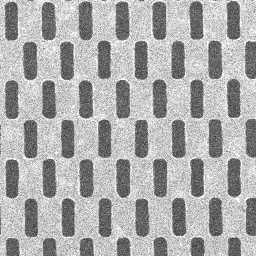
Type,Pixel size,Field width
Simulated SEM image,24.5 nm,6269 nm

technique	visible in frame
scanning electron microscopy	a regular array of holes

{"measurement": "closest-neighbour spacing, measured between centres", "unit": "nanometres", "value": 904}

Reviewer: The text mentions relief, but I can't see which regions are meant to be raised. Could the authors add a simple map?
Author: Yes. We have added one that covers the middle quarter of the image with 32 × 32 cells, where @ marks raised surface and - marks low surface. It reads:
---@@@@@----@@@@@@---@@@@@@---@@
---@@@@@----@@@@@@---@@@@@@---@@
---@@@@@----@@@@@@---@@@@@@---@@
--@@@@@@@--@@@@@@@---@@@@@@---@@
@@@@--@@@@@@@---@@@@@@---@@@@@@@
@@@@---@@@@@@----@@@@@----@@@@@-
@@@@---@@@@@@----@@@@@----@@@@@-
@@@@---@@@@@@----@@@@@----@@@@@-
@@@@---@@@@@@----@@@@@----@@@@@-
@@@@---@@@@@@----@@@@@----@@@@@-
@@@@---@@@@@@----@@@@@----@@@@@-
@@@@---@@@@@@----@@@@@----@@@@@-
@@@@---@@@@@@----@@@@@----@@@@@@
@@@@---@@@@@@@--@@@@@@@--@@@@@@@
--@@@@@@@--@@@@@@@---@@@@@@---@@
---@@@@@----@@@@@@---@@@@@@---@@
---@@@@@----@@@@@@---@@@@@@---@@
---@@@@@----@@@@@@---@@@@@@---@@
---@@@@@----@@@@@@---@@@@@@---@@
---@@@@@----@@@@@@---@@@@@@---@@
---@@@@@----@@@@@@---@@@@@@----@
---@@@@@----@@@@@@---@@@@@@----@
---@@@@@@---@@@@@@---@@@@@@---@@
--@@@@@@@@-@@@@@@@@-@@@@@@@@-@@@
@@@@---@@@@@@---@@@@@@----@@@@@@
@@@@---@@@@@@----@@@@@----@@@@@@
@@@@---@@@@@@----@@@@@----@@@@@@
@@@@---@@@@@@----@@@@@----@@@@@@
@@@@---@@@@@@----@@@@@----@@@@@@
@@@@---@@@@@@----@@@@@----@@@@@@
@@@@----@@@@@----@@@@@----@@@@@@
@@@@----@@@@@----@@@@@----@@@@@@